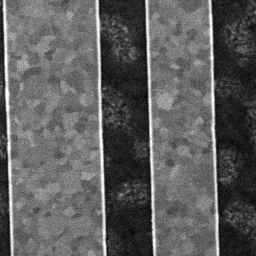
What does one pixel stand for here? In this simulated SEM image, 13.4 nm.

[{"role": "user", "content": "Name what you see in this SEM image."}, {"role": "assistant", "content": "one or a few lines or trenches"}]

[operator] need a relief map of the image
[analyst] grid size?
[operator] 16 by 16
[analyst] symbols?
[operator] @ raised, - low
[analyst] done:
@@@@@@---@@@@---
@@@@@@---@@@@---
@@@@@@---@@@@---
@@@@@@---@@@@---
@@@@@@---@@@@---
@@@@@@---@@@@---
@@@@@@---@@@@---
@@@@@@---@@@@---
-@@@@@---@@@@---
-@@@@@---@@@@---
-@@@@@---@@@@---
-@@@@@----@@@---
-@@@@@----@@@@--
-@@@@@@---@@@@--
-@@@@@@---@@@@--
-@@@@@@---@@@@--